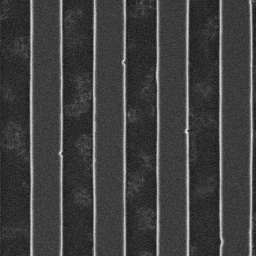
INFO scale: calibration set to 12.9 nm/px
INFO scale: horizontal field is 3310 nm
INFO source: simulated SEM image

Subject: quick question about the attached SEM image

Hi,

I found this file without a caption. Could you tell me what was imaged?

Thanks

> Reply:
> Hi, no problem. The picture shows parallel lines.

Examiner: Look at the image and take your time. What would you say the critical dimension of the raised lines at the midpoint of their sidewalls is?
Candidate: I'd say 393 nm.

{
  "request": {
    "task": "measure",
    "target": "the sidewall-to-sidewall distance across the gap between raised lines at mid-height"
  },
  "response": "428 nm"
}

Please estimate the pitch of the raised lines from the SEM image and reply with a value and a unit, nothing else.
818 nanometres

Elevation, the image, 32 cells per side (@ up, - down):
----@@@@----@@@@----@@@-----@@@-
----@@@@----@@@@----@@@-----@@@-
----@@@@----@@@@----@@@-----@@@-
----@@@@----@@@@----@@@-----@@@-
----@@@@----@@@@----@@@-----@@@-
----@@@@----@@@@----@@@-----@@@-
----@@@@----@@@@----@@@-----@@@-
----@@@@----@@@@----@@@-----@@@-
----@@@@----@@@@----@@@-----@@@-
----@@@@----@@@@----@@@-----@@@-
----@@@@----@@@@----@@@-----@@@-
----@@@@----@@@@----@@@-----@@@-
----@@@@----@@@@----@@@-----@@@-
----@@@@----@@@@----@@@-----@@@-
----@@@@----@@@@----@@@-----@@@-
----@@@@----@@@@----@@@-----@@@-
----@@@@----@@@@----@@@-----@@@-
----@@@@----@@@@----@@@-----@@@-
----@@@@----@@@@----@@@-----@@@-
----@@@@----@@@@----@@@-----@@@-
----@@@@----@@@@----@@@-----@@@-
----@@@@----@@@@----@@@-----@@@-
----@@@@----@@@@----@@@-----@@@-
----@@@@----@@@@----@@@-----@@@-
----@@@@----@@@@----@@@-----@@@-
----@@@@----@@@@----@@@-----@@@-
----@@@@----@@@@----@@@-----@@@-
----@@@@----@@@@----@@@-----@@@-
----@@@@----@@@@----@@@-----@@@-
----@@@@----@@@@----@@@-----@@@-
----@@@@----@@@@----@@@-----@@@-
----@@@@----@@@@----@@@-----@@@-